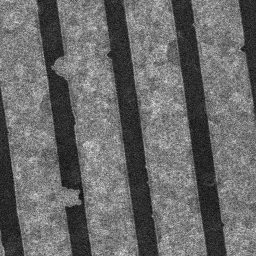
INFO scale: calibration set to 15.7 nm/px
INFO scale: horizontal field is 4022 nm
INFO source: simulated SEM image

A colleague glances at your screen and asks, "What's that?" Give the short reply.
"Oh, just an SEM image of one or a few lines or trenches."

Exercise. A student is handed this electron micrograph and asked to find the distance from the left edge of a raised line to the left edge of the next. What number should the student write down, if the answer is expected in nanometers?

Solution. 1050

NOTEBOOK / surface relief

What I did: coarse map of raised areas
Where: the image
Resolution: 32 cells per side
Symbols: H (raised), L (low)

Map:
HHHHHLLHHHHHHLLLHHHHHLLLHHHHHHLL
HHHHHLLHHHHHHLLLHHHHHHLLHHHHHHLL
HHHHHLLLHHHHHLLLHHHHHHLLHHHHHHLL
HHHHHLLLHHHHHLLLHHHHHHLLHHHHHHLL
HHHHHLLLHHHHHLLLHHHHHHLLLHHHHHLL
HHHHHLLLHHHHHHLLHHHHHHLLLHHHHHLL
HHHHHLLLHHHHHHLLHHHHHHLLLHHHHHLL
HHHHHHLHHHHHHHLLLHHHHHLLLHHHHHHL
HHHHHHLHHHHHHHLLLHHHHHHLLHHHHHHL
HHHHHHLLHHHHHHLLLHHHHHHLLHHHHHHL
HHHHHHLLLHHHHHLLLHHHHHHLLHHHHHHL
HHHHHHLLLHHHHHLLLHHHHHHLLLHHHHHL
HHHHHHLLLHHHHHHLLHHHHHHLLLHHHHHH
LHHHHHLLLHHHHHHLLHHHHHHLLLHHHHHH
LHHHHHHLLHHHHHHLLLHHHHHLLLHHHHHH
LHHHHHHLLHHHHHHLLLHHHHHHLLHHHHHH
LHHHHHHLLHHHHHHLLLHHHHHHLLHHHHHH
LHHHHHHLLLHHHHHLLLHHHHHHLLHHHHHH
LHHHHHHLLLHHHHHLLLHHHHHHLLLHHHHH
LHHHHHHLLLHHHHHHLLHHHHHHLLLHHHHH
LHHHHHHLLLHHHHHHLLHHHHHHLLLHHHHH
LLHHHHHLLLHHHHHHLLLHHHHHLLLHHHHH
LLHHHHHHLLHHHHHHLLLHHHHHHLLHHHHH
LLHHHHHHLLHHHHHHLLLHHHHHHLLHHHHH
LLHHHHHHHHHHHHHHLLLHHHHHHLLHHHHH
LLHHHHHHHHLHHHHHLLLHHHHHHLLLHHHH
LLHHHHHHLLLHHHHHHLLHHHHHHLLLHHHH
LLHHHHHHLLLHHHHHHLLHHHHHHLLLHHHH
LLLHHHHHLLLHHHHHHLLHHHHHHLLLHHHH
LLLHHHHHHLLHHHHHHLLLHHHHHLLLHHHH
LLLHHHHHHLLHHHHHHLLLHHHHHHLLHHHH
LLLHHHHHHLLHHHHHHLLLHHHHHHLLHHHH